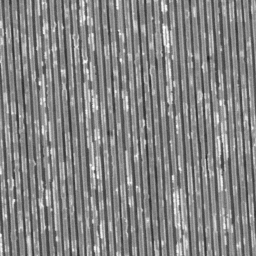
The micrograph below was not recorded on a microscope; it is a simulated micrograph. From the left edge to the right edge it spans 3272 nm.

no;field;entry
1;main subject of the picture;parallel lines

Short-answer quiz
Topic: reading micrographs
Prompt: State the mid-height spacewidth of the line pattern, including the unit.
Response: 46.2 nm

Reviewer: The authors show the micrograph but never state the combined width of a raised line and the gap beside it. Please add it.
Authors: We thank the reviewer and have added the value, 95.3 nanometres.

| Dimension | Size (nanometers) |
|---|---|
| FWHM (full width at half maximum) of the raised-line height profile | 57.4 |